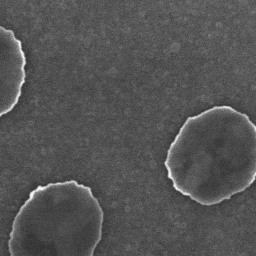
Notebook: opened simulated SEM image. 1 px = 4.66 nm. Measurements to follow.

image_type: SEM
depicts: raised bodies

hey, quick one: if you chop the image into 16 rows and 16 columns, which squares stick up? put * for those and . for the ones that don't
................
................
*...............
*...............
**..............
*...............
*...............
............****
...........*****
...........*****
..........******
...**......*****
..****......**..
.*****..........
.*****..........
.*****..........